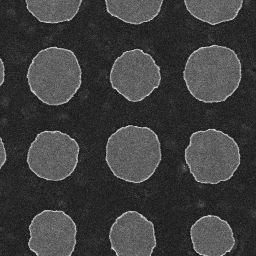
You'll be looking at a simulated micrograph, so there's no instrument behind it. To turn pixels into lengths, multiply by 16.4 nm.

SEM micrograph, raised bodies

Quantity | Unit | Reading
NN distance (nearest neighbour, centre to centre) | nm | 1290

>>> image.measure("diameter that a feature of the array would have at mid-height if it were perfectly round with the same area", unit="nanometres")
894